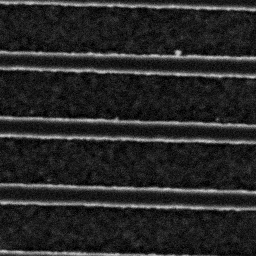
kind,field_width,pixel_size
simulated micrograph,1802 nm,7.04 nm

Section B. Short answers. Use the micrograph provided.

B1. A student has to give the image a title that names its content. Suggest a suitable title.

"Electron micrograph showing lines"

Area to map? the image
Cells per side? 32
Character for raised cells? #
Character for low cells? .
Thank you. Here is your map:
.......#########################
................................
................................
................................
................................
................................
#...............................
################################
################################
...........................#####
................................
................................
................................
................................
................................
#############################...
################################
.................###############
................................
................................
................................
................................
................................
#################...............
################################
...#############################
................................
................................
................................
................................
................................
###.............................